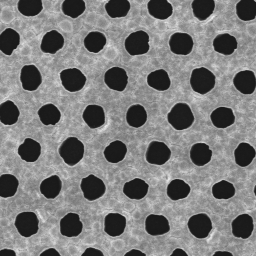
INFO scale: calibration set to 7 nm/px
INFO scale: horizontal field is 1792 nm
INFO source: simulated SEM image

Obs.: a regular array of holes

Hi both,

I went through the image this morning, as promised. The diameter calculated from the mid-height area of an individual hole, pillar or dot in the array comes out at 23.3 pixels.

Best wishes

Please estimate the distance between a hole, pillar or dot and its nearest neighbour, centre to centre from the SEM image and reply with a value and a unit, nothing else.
41.6 px